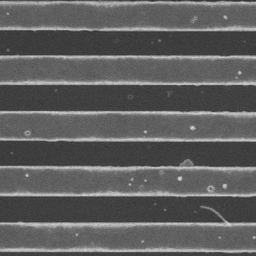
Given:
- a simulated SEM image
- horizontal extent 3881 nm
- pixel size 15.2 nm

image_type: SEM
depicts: lines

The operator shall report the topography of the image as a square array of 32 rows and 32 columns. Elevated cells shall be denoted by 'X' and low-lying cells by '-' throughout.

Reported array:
XXXXXXXXXXXXXXXXXXXXXXXXXXXXXXXX
XXXXXXXXXXXXXXXXXXXXXXXXXXXXXXXX
XXXXXXXXXXXXXXXXXXXXXXXXXXXXXXXX
XXXXXXXXXXXXXXXXXXXXXXXXXXXXXXXX
--------------------------------
--------------------------------
--------------------------------
XXXXXXXXXXXXXXXXXXXXXXXXXXXXXXXX
XXXXXXXXXXXXXXXXXXXXXXXXXXXXXXXX
XXXXXXXXXXXXXXXXXXXXXXXXXXXXXXXX
XXXXXXXXXXXXXXXXXXXXXXXXXXXXXXXX
--------------------------------
--------------------------------
--------------------------------
XXXXXXXXXXXXXXXXXXXXXXXXXXXXXXXX
XXXXXXXXXXXXXXXXXXXXXXXXXXXXXXXX
XXXXXXXXXXXXXXXXXXXXXXXXXXXXXXXX
XXXXXXXXXXXXXXXXXXXXXXXXXXXXXXXX
--------------------------------
--------------------------------
--------------------------------
XXXXXXXXXXXXXXXXXXXXXXXXXXXXXXXX
XXXXXXXXXXXXXXXXXXXXXXXXXXXXXXXX
XXXXXXXXXXXXXXXXXXXXXXXXXXXXXXXX
------------------------------X-
--------------------------------
--------------------------------
--------------------------------
XXXXXXXXXXXXXXXXXXXXXXXXXXXXXXXX
XXXXXXXXXXXXXXXXXXXXXXXXXXXXXXXX
XXXXXXXXXXXXXXXXXXXXXXXXXXXXXXXX
----------------------------X---